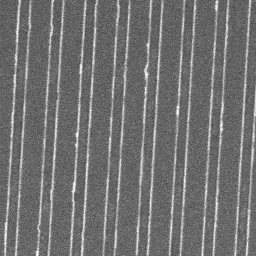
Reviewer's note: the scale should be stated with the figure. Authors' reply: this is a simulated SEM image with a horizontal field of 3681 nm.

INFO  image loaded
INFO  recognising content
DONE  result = parallel lines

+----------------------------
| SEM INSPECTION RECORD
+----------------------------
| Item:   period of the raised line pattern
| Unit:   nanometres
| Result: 473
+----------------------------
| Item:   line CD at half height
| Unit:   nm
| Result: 327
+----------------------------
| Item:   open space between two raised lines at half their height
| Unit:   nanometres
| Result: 156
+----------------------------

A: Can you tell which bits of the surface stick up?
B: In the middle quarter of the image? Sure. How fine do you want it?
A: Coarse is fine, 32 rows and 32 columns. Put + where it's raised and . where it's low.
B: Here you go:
++++...++++++...+++++...+++++...
++++...++++++..+++++....+++++...
++++...+++++...++++++...+++++...
++++...+++++...++++++...+++++...
++++...+++++...++++++..++++++...
++++...+++++...+++++...++++++...
++++...+++++...+++++...++++++...
++++...+++++...+++++...++++++..+
++++...+++++...+++++...++++++..+
++++...+++++...+++++...++++++..+
++++...+++++...+++++...++++++..+
++++...+++++...+++++...++++++..+
++++...+++++...+++++...+++++...+
++++...+++++...+++++...+++++...+
++++...+++++...+++++...+++++...+
++++..++++++...+++++...+++++...+
+++...++++++...+++++...+++++...+
+++...++++++...+++++...+++++...+
+++...++++++..++++++...+++++...+
+++...+++++...++++++...+++++...+
+++...+++++...++++++...+++++...+
+++...+++++...++++++..++++++...+
+++...+++++...+++++...++++++...+
+++...+++++...+++++...++++++...+
+++...+++++...+++++...++++++..++
+++...+++++...+++++...++++++..++
+++...+++++...+++++...++++++..++
+++...+++++...+++++...++++++..++
+++...+++++...+++++...++++++..++
+++...+++++...+++++...+++++...++
+++...+++++...+++++...+++++...++
+++...+++++...+++++...+++++...++